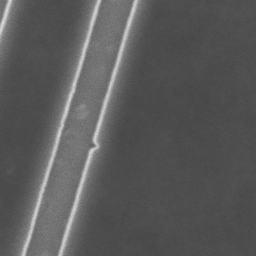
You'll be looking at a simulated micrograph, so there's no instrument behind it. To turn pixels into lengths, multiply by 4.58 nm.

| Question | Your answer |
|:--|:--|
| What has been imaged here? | one or a few lines or trenches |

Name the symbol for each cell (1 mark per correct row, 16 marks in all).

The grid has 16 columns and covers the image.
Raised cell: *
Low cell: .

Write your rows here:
******..********
******..********
******..********
*****..*********
*****..*********
*****..*********
****...*********
****..**********
****..**********
***...**********
***..***********
***..***********
**...***********
**..************
**..************
**..************